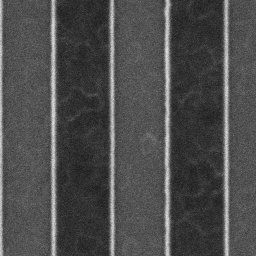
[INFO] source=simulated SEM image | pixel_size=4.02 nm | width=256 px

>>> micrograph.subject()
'one or a few lines or trenches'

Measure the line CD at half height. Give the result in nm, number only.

242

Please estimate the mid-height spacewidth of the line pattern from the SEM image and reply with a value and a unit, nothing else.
210 nm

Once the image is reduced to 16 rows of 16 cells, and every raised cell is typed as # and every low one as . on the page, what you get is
...####...####..
...####...####..
...####...####..
...####...####..
...####...####..
...####...####..
...####...####..
...####...####..
...####...####..
...####...####..
...####...####..
...####...####..
...####...####..
...####...####..
...####...####..
...####...####..